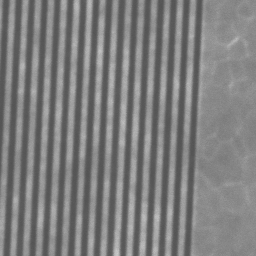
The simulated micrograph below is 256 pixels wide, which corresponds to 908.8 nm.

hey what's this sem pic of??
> parallel lines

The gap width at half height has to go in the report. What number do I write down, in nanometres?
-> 24.4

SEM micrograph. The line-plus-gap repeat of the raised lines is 0.0458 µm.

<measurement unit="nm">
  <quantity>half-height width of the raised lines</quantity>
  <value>21.3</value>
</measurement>